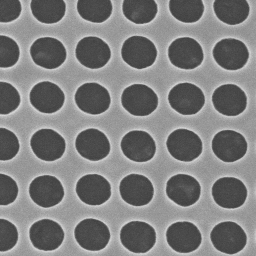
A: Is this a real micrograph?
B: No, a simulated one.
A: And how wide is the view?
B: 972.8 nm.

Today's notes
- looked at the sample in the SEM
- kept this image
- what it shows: a regular array of holes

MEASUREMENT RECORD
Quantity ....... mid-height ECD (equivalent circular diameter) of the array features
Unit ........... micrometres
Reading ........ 0.13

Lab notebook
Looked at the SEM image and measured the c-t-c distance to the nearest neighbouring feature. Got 0.17 micrometres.